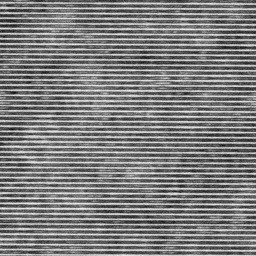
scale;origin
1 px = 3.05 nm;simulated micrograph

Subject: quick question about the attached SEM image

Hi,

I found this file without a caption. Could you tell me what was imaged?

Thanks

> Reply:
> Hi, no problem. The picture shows parallel lines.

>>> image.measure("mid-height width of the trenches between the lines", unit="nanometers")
11.8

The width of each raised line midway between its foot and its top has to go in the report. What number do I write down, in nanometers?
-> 3.1